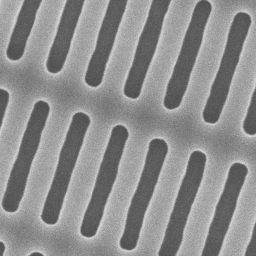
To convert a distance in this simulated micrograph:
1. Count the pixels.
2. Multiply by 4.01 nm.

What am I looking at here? holes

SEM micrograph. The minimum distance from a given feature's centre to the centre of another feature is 41.3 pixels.